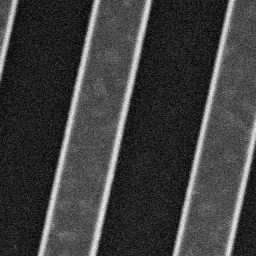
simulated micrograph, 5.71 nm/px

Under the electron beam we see one or a few lines or trenches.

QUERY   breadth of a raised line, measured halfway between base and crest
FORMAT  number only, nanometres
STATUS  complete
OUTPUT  302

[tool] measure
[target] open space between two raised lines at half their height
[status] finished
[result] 448 nm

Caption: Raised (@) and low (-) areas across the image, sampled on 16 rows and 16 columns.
@-----@@@-----@@
@-----@@@-----@@
-----@@@@-----@@
-----@@@@-----@@
-----@@@-----@@@
-----@@@-----@@@
-----@@@-----@@@
----@@@@-----@@@
----@@@------@@@
----@@@-----@@@@
----@@@-----@@@@
---@@@@-----@@@-
---@@@@-----@@@-
---@@@-----@@@@-
---@@@-----@@@@-
---@@@-----@@@--